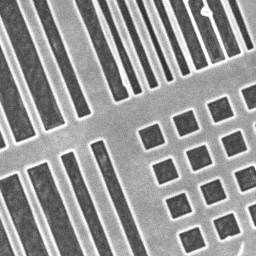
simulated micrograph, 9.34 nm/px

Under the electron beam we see groups of lines, slits or small figures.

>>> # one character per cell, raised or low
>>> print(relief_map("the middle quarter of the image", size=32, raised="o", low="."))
..ooooooo....oo..oo...oo..ooo..o
...oooooo.....o..ooo..ooo.ooo..o
...ooooooo....o...oo..ooo..oo..o
...ooooooo....oo..oo...oo..ooooo
....ooooooo....o...oo..ooooooooo
o...ooooooo....oo..oo..ooooooooo
o...ooooooo.....o..ooooooooooooo
o....ooooooo....oo.ooooooooooooo
oo...ooooooo....oooooooooooooooo
oo....oooooooooooooooooooooooooo
ooo...oooooooooooooooooooooooooo
ooo...oooooooooooooooooooooooooo
ooo....oooooooooooooooooooooo...
ooooooooooooooooooooooooooo.....
ooooooooooooooooooooooooooo.....
oooooooooooooooooooooo..oooo....
ooooooooooooooooooo.....oooo....
ooooooooooooooooooo......oooo..o
ooooooooooooooooooo......ooooooo
oooooooo..ooooooooo......ooooooo
oooooo....oooooooooo....oooooooo
ooooooo....ooooooooo.ooooooooooo
...oooo....ooooooooooooooooooo..
...ooooo...oooooooooooooooooooo.
...ooooo....oooooooooooo...oooo.
....oooo....oooooooooo......oooo
....ooooo....ooooooooo......oooo
o...ooooo....oooooooooo......ooo
o....ooooo...oooooooooo.....oooo
oo...ooooo....ooooooooo...oooooo
oo....oooo....oooooooooooooooooo
oo....ooooo....ooooooooooooooooo